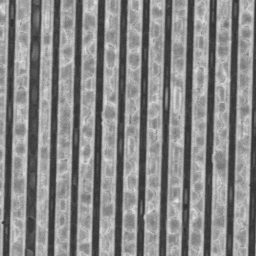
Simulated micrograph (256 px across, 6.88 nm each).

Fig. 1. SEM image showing parallel lines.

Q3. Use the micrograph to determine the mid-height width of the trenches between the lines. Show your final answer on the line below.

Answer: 9.11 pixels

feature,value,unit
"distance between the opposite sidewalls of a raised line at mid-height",94.5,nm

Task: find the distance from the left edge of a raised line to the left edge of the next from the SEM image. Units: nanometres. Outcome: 153